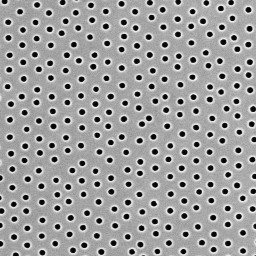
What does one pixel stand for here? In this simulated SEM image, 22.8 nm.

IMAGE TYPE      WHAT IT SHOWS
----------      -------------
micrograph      a regular array of holes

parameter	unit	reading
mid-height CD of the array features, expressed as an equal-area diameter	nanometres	136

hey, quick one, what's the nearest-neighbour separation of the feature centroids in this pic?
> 323 nanometres